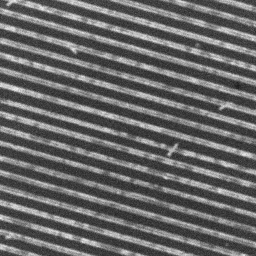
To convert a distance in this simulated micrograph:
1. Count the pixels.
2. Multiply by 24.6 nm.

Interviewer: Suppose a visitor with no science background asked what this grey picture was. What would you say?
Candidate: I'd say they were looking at parallel lines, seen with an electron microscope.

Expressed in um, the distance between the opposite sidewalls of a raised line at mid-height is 0.0889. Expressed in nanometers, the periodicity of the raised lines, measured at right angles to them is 349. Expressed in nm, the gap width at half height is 267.